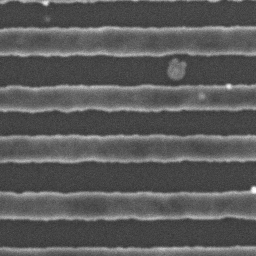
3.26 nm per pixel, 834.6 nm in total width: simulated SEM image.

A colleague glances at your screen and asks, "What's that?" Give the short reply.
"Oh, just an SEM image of lines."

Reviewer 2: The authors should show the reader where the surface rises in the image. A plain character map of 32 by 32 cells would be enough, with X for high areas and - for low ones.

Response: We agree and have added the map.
-----X--------------------------
--------------------------------
--------------------------------
-------------XX-------XX-XXXXXXX
XXXXXXXXXXXXXXXXXXXXXXXXXXXXXXXX
XXXXXXXXXXXXXXXXXXXXXXXXXXXXXXXX
XXXXXXXXXXXXXXXXXXXXXXXXXXXXXXXX
--------------------------------
---------------------XX---------
---------------------XX---------
--------------------------------
XXXXXXXXXXXXXXXXXXXXXXXXXXXXXXXX
XXXXXXXXXXXXXXXXXXXXXXXXXXXXXXXX
XXXXXXXXXXXXXXXXXXXXXXXXXXXXXXXX
--------------------------------
--------------------------------
--------------------------------
XXXXXXXXXXXXXXXXXXXXXXXXXXXXXXXX
XXXXXXXXXXXXXXXXXXXXXXXXXXXXXXXX
XXXXXXXXXXXXXXXXXXXXXXXXXXXXXXXX
--------------------------------
--------------------------------
--------------------------------
--------------------------------
XXXXXXXXXXXXXXXXXXXXXXXXXXXXXXXX
XXXXXXXXXXXXXXXXXXXXXXXXXXXXXXXX
XXXXXXXXXXXXXXXXXXXXXXXXXXXXXXXX
-----X-----X--------------------
--------------------------------
--------------------------------
--------------------------------
XXXXXXXXXXXXXXXXXXXXXXXXXXXXXXXX